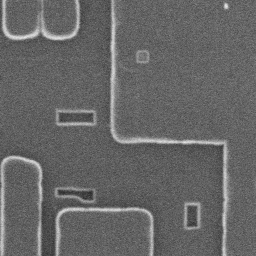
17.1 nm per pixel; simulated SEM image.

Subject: wiring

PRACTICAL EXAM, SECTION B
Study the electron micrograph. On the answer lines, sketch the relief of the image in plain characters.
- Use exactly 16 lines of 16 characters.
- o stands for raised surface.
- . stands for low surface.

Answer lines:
ooooo..ooooooooo
ooooo..ooooooooo
.......ooooooooo
.......ooooooooo
.......ooooooooo
.......ooooooooo
.......ooooooooo
.......ooooooooo
.......ooooooooo
..............oo
oo............oo
ooo...........oo
ooo...........oo
ooo.ooooo.....oo
oo..oooooo....oo
oo..oooooo....oo